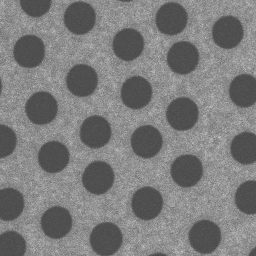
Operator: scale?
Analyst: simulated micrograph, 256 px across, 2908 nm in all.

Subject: a regular array of holes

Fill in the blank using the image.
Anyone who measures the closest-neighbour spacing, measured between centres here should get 49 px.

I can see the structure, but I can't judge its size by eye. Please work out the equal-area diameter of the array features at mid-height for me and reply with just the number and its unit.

0.38 microns